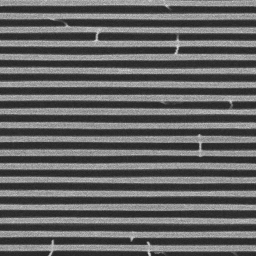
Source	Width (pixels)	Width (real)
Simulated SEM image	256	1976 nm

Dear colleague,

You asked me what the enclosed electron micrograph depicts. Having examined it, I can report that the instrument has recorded parallel lines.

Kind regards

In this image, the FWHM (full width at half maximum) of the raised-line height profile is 51.2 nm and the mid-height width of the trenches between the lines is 0.0512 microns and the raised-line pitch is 105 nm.